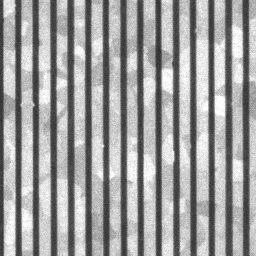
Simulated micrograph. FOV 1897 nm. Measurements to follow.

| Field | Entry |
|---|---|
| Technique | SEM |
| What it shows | parallel lines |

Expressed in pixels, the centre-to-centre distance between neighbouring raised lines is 17.5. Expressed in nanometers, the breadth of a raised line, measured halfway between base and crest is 86.1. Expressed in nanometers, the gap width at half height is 46.3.